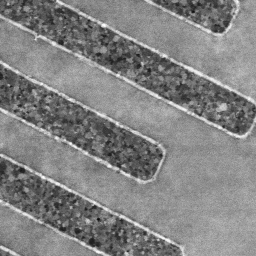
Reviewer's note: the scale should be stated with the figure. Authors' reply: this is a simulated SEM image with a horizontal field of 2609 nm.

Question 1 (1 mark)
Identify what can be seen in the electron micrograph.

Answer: one or a few lines or trenches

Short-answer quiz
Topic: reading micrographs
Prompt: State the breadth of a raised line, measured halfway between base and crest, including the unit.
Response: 0.408 um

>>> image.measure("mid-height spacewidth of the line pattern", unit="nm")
423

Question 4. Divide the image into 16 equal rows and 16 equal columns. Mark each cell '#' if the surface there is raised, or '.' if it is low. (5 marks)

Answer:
####......#####.
.#####......##..
...#####........
.....#####......
#......#####....
###......#####..
#####......#####
.######......###
...######.......
.....#####......
##.....###......
####............
######..........
..######........
....#####.......
......#####.....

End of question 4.